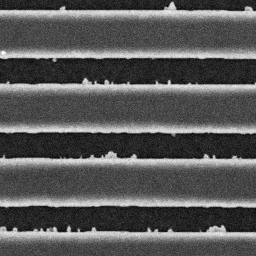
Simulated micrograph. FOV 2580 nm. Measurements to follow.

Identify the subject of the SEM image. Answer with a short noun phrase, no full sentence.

lines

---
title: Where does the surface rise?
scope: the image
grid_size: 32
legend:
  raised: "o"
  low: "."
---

................................
ooooooooooooooooooooooo..oooo...
oooooooooooooooooooooooooooooooo
oooooooooooooooooooooooooooooooo
oooooooooooooooooooooooooooooooo
oooooooooooooooooooooooooooooooo
oooooooooooooooooooooooooooooooo
................................
................................
................................
................................
oooooooooooooooooooooooooooooooo
oooooooooooooooooooooooooooooooo
oooooooooooooooooooooooooooooooo
oooooooooooooooooooooooooooooooo
oooooooooooooooooooooooooooooooo
..............................o.
................................
................................
................................
oooooooooooooooooooooooooooooooo
oooooooooooooooooooooooooooooooo
oooooooooooooooooooooooooooooooo
oooooooooooooooooooooooooooooooo
oooooooooooooooooooooooooooooooo
oooooooooooooooooooooooooooooooo
................................
................................
................................
oooooooooooooooooooooooooooooooo
oooooooooooooooooooooooooooooooo
oooooooooooooooooooooooooooooooo